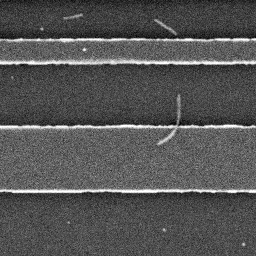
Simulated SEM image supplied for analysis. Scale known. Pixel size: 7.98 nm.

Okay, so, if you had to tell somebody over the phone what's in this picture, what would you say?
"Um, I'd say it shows lines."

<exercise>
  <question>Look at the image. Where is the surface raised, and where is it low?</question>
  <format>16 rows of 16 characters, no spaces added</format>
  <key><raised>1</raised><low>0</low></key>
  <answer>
0000000000000000
0000000000000000
1111111111111111
1111111111111111
0000000000000000
0000000000000000
0000000000000000
0000000000000000
1111111111111111
1111111111111111
1111111111111111
1111111111111111
0000000000000000
0000000000000000
0000000000000000
0000000000000000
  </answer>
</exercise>